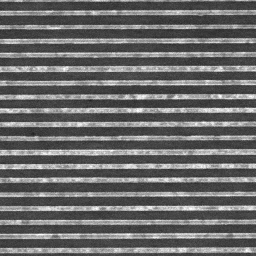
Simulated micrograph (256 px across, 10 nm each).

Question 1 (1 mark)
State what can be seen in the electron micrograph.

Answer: parallel lines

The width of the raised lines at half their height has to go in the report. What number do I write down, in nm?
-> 45.1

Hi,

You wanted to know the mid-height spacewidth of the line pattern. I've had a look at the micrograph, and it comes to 100 nanometres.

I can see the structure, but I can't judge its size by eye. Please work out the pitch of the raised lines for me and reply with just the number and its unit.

0.14 micrometres